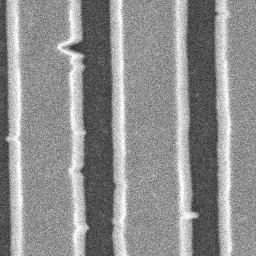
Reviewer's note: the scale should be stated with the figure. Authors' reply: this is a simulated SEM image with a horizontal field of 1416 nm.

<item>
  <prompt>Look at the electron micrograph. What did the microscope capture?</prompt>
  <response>one or a few lines or trenches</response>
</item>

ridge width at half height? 65.8 px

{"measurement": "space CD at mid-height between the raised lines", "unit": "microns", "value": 0.211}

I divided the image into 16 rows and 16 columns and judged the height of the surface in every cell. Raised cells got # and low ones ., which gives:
.####..####...##
.####..####...##
.####..####...##
.####..####...##
.####..####...##
.####..####...##
.####..####...##
.####..#####..##
.####..####...##
.####..####...##
.####..#####..##
.####..#####..##
.####..#####..##
.####..#####..##
.####..#####..##
.####..#####..##